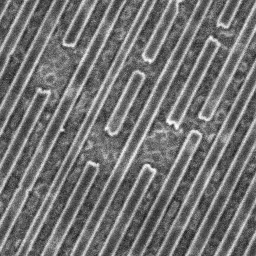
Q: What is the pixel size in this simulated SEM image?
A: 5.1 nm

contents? parallel lines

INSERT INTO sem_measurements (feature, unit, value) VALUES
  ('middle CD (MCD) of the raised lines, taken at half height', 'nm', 62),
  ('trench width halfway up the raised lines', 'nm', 71.7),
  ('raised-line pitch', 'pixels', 25.8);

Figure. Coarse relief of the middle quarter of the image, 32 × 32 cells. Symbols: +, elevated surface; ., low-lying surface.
....+++.....++...........++++...
...++++.....++...........+++....
...+++.....++....+++....++++....
..++++.....++....+++....+++....+
..+++.....++....++++...++++....+
.++++.....++....+++....+++....++
.+++.....++....++++...++++....++
++++.....++....+++....+++....+++
+++.....++....++++...++++....+++
+++.....++....+++....+++....++++
++.....++....++++...++++....+++.
++.....++....+++....+++....++++.
+.....++....++++...++++....+++..
+.....++....+++....+++....++++..
.....+++...++++...++++....+++...
....+++....+++....+++.......+...
....++.....+++...++++...........
...+++......+....+++...........+
...++...........++++...........+
..+++...........+++...........++
..++...........++++...........++
.+++...........+++...........+++
.++...........++++...........+++
+++...........+++...........++++
++............+++...........+++.
++...++++....+++....+......++++.
+....+++....++++...++++....+++..
+....+++....+++....+++....++++..
....++++...++++...++++....+++...
....+++....+++....+++....++++...
...++++...++++....+++....+++....
..++++....+++....+++....++++....